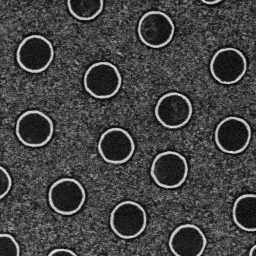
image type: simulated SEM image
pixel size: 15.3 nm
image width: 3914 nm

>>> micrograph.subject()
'a regular array of raised bodies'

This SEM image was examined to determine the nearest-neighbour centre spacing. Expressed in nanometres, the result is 1010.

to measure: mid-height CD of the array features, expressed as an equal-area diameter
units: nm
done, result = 528